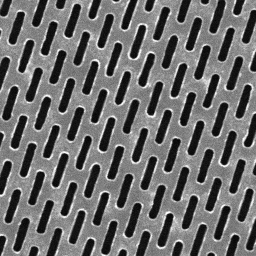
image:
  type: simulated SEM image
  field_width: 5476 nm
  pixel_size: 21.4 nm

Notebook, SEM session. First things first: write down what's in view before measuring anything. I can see a regular array of holes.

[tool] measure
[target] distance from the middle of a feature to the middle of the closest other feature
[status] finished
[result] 0.631 µm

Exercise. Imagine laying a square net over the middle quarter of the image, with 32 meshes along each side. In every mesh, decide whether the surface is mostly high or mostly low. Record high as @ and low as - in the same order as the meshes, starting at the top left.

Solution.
@@@@@@@--@@--@@@@@@@--@@--@@@--@
@@@@@@--@@@--@@@@@@@--@@@@@@---@
@@@@@@--@@@-@@@--@@--@@@@@@@--@@
@@@@@---@@@@@@---@@--@@@@@@@--@@
@--@@--@@@@@@@--@@@--@@-@@@---@@
---@@--@@@@@@@--@@@-@@@--@@--@@@
--@@@--@@-@@@@--@@@@@@---@@--@@@
--@@@-@@@--@@--@@@@@@@--@@@--@@-
--@@@@@@---@@--@@@@@@@--@@@@@@@-
-@@@@@@@--@@@--@@--@@---@@@@@@--
-@@@@@@@--@@@@@@---@@--@@@@@@@--
-@@--@@--@@@@@@@--@@@--@@@@@@@--
@@@--@@--@@@@@@@--@@@--@@--@@---
@@--@@@--@@--@@@--@@@@@@@--@@--@
@@--@@@-@@@--@@--@@@@@@@--@@@--@
@@--@@@@@@---@@--@@@@@@@--@@@@@@
@---@@@@@@--@@@--@@--@@@--@@@@@@
@--@@@@@@@--@@@@@@@--@@--@@@@@@@
@--@@--@@---@@@@@@---@@--@@@@@@@
@@@@@--@@--@@@@@@@--@@@--@@--@@@
@@@@--@@@--@@@@@@@--@@@@@@@--@@-
@@@@--@@@--@@--@@---@@@@@@--@@@-
-@@@--@@@@@@---@@--@@@@@@@--@@@-
-@@---@@@@@@---@@--@@--@@@--@@@@
-@@--@@@@@@@--@@@@@@@--@@---@@@@
-@@--@@--@@@--@@@@@@@--@@--@@@@@
@@@@@@@--@@---@@@@@@---@@--@@--@
@@@@@@---@@--@@@@@@@--@@@@@@@--@
@@@@@@--@@@--@@--@@@--@@@@@@@--@
@@-@@@--@@@@@@@--@@---@@@@@@---@
@--@@---@@@@@@---@@--@@@-@@@--@@
@--@@--@@@@@@@--@@@@-@@--@@@--@@